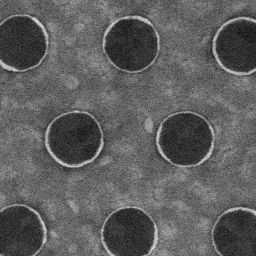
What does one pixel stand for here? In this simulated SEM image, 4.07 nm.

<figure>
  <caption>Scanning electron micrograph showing raised bodies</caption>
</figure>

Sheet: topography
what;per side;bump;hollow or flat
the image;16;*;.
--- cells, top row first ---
................
***....**.....**
***...****...***
***....***...***
..............**
................
................
...***....***...
...***....***...
...***....***...
................
................
................
**.....**.....**
***...****...***
***....***...***